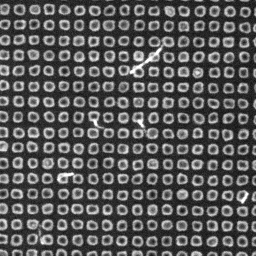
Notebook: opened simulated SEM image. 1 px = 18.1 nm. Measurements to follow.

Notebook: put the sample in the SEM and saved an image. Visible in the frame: a regular array of raised bodies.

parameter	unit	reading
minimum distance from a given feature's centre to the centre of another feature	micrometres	0.263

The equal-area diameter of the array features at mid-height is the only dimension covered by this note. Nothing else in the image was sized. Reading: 185 nm